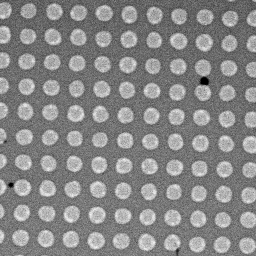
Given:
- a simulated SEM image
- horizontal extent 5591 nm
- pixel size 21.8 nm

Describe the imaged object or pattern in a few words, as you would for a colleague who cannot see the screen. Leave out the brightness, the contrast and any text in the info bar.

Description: an array of small figures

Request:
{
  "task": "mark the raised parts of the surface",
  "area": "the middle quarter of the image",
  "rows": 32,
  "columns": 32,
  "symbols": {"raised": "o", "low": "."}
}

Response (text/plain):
.oooo...ooo...oooo...ooo...ooo..
..oo.....oo...ooo....ooo...ooo..
................................
................................
..oo.....o......................
.oooo...ooo...ooo....oo....ooo..
.oooo...ooo...oooo..oooo...ooo..
..oo....ooo...ooo...oooo..oooo..
...........................ooo..
................................
..oo............................
.oooo..ooo....ooo....oo....oo...
.oooo..oooo...ooo...oooo..oooo..
.oooo..oooo...ooo...oooo..oooo..
...............o.....oo....ooo..
................................
................................
.ooo....oo....oo................
.ooo...oooo...ooo...ooo...ooo...
.ooo...oooo..oooo...ooo...oooo..
........oo....ooo...ooo...ooo...
................................
................................
.ooo....oo......................
.ooo...oooo..oooo...ooo...ooo...
.ooo...oooo..oooo...ooo...oooo..
..oo...ooo...oooo...ooo...ooo...
..........................ooo...
................................
..o.............................
oooo...ooo...ooo....oo.....oo...
oooo...ooo...oooo..oooo...ooo...